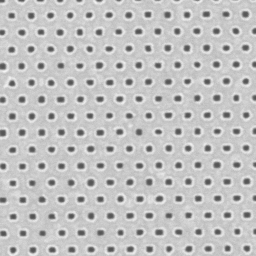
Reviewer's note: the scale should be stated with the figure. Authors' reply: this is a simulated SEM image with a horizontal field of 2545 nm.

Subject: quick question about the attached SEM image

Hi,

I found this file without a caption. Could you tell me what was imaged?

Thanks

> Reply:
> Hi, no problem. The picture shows a regular array of holes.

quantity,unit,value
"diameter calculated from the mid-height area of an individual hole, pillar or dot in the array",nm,68.2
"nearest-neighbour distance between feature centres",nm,187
